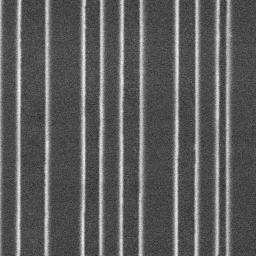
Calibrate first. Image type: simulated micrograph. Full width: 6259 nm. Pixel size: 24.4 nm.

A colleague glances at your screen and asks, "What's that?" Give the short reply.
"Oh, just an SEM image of lines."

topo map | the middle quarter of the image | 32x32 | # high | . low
#####....#####.....#########....
#####....#####.....#########....
#####....#####.....#########....
#####....#####.....#########....
#####....#####.....#########....
#####....#####.....#########....
#####....#####.....#########....
#####....#####.....#########....
#####....#####.....#########....
#####....#####.....#########....
#####....#####.....#########....
#####....#####.....#########....
#####....#####.....#########....
#####....#####.....#########....
#####....#####.....#########....
#####....#####.....#########....
#####....#####.....#########....
#####....#####.....#########....
#####....#####.....#########....
#####....#####.....#########....
#####....#####.....#########....
#####....#####.....#########....
#####....#####.....#########....
#####....#####.....#########....
#####....#####.....#########....
#####....#####.....#########....
#####....#####.....#########....
#####....#####.....#########....
#####....#####.....#########....
#####....#####.....#########....
#####....#####.....#########....
#####....#####.....#########....